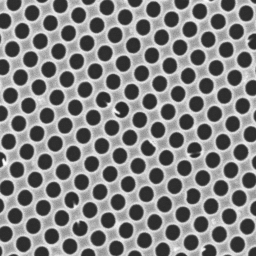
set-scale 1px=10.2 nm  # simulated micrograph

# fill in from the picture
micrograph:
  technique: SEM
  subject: a regular array of holes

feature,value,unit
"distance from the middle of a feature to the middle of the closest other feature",208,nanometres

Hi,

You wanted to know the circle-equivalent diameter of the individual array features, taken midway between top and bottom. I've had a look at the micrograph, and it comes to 0.157 microns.